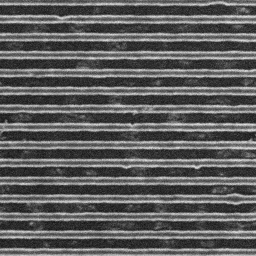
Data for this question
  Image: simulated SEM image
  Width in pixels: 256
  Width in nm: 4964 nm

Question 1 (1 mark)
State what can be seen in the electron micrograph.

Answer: parallel lines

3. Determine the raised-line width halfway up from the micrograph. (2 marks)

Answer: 7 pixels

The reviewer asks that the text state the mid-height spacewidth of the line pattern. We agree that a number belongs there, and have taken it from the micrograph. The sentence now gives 11.2 pixels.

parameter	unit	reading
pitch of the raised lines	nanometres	348